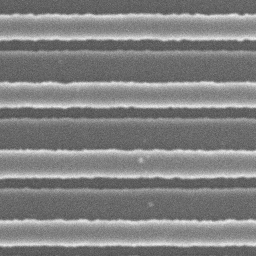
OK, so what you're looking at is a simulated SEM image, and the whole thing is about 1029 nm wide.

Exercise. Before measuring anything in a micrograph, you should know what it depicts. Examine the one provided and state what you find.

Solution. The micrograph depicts lines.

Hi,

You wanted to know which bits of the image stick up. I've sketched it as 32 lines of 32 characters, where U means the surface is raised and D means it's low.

DDDDDDDDDDDDDDDDDDDDDDDDDDDDDDDD
DDDDDDDDDDDDDDDDDDDDDDDDDDDDDDDD
UUUUUUUUUUUUUUUUUUUUUUUUUUUUUUUU
UUUUUUUUUUUUUUUUUUUUUUUUUUUUUUUU
UUUUUUUUUUUUUUUUUUUUUUUUUUUUUUUU
DDDDDDDDDDDDDDDDDDDDDDDDDDDDDDDD
DDDDDDDDDDDDDDDDDDDDDDDDDDDDDDDD
DDDDDDDDDDDDDDDDDDDDDDDDDDDDDDDD
DDDDDDDDDDDDDDDDDDDDDDDDDDDDDDDD
DDDDDDDDDDDDDDDDDDDDDDDDDDDDDDDD
UUUUUUUUUUUUUUUUUUUUUUUUUUUUUUUU
UUUUUUUUUUUUUUUUUUUUUUUUUUUUUUUU
UUUUUUUUUUUUUUUUUUUUUUUUUUUUUUUU
DDDDDDDDDDDDDDDDDDDDDDDDDDDDDDDD
DDDDDDDDDDDDDDDDDDDDDDDDDDDDDDDD
DDDDDDDDDDDDDDDDDDDDDDDDDDDDDDDD
DDDDDDDDDDDDDDDDDDDDDDDDDDDDDDDD
DDDDDDDDDDDDDDDDDDDDDDDDDDDDDDDD
DDDDDDDDDDDDDDDDDDDDDDDDDDDDDDDD
UUUUUUUUUUUUUUUUUUUUUUUUUUUUUUUU
UUUUUUUUUUUUUUUUUUUUUUUUUUUUUUUU
UUUUUUUUUUUUUUUUUUUUUUUUUUUUUUUU
DDDDDDDDDDDDDDDDDDDDDDDDDDDDDDDD
DDDDDDDDDDDDDDDDDDDDDDDDDDDDDDDD
DDDDDDDDDDDDDDDDDDDDDDDDDDDDDDDD
DDDDDDDDDDDDDDDDDDDDDDDDDDDDDDDD
DDDDDDDDDDDDDDDDDDDDDDDDDDDDDDDD
DDDDDDDDDDDDDDDDDDDDDDDDDDDDDDDD
UUUUUUUUUUUUUUUUUUUUUUUUUUUUUUUU
UUUUUUUUUUUUUUUUUUUUUUUUUUUUUUUU
UUUUUUUUUUUUUUUUUUUUUUUUUUUUUUUU
DDDDDDDDDDDDDDDDDDDDDDDDDDDDDDDD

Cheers